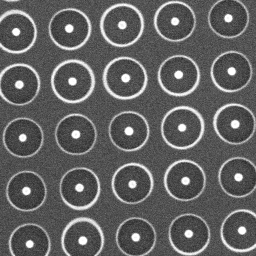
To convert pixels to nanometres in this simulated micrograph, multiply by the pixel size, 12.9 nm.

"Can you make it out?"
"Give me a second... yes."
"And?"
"an array of small figures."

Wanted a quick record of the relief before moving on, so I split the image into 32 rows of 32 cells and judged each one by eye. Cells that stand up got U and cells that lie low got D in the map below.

UUUUUUUUUUUUUUUUUUUUUDDUUUUDDDUU
UUUUUUUUDDUUUDDDDUUUDDDDUUDDDDDU
DDDDUUUDDDDUUDDDDDUUDDDDUUDDDDDU
DDDDUUDDDDDUUDDDDDUUDDDDUUUDDDDU
DDDDUUDDDDDUUDDDDUUUDDDUUUUUDUUU
DDDDUUUDDDUUUUDDUUUUUUUUUUUUUUUU
UUUUUUUUUUUUUUUUUUUUUUUUUUUUUUUU
UUUUUUUUUUUUUUUDDUUUUDDDUUUDDDDU
UDDDUUUDDDDUUDDDDDUUDDDDDUUDDDDU
DDDDDUUDDDDDUDDDDDUUDDDDDUUDDDDU
DDUDDUUDDDDDUDDDDDUUDDDDUUUDDDDU
DDDDDUUDDDDUUUDDDDUUUDDDUUUUUUUU
UDDDUUUUDDUUUUUUUUUUUUUUUUUUUUUU
UUUUUUUUUUUUUUUUUUUUUUDUUUUUDDDU
UUUUUUUUUDUUUUUDDUUUUDDDDUUDDDDD
UDDDUUUDDDDDUUDDDDUUDDDDDUUDDUDD
UDDDDUUDDDDDUUDDDDUUDDDDDUUDDDDD
UDDDDUUDDDDDUUDDDDUUUDDDDUUUDDDU
UDDDDUUUDDDUUUUDDUUUUUUUUUUUUUUU
UUDUUUUUUUUUUUUUUUUUUUUUUUUUUUUU
UUUUUUUUUUUUUUUUUUUUUUDDUUUUDDDU
UUUUUUUUUDDUUUUDDDUUUDDDDUUUDDDD
UDDDDUUUDDDDUUDDDDDUUDDDDDUUDDDD
UDDDDDUUDDDDUUDDDDDUUDDDDUUUDDDD
UDDDDDUUDDDDUUUDDDUUUUDDDUUUUDUU
UUDDDUUUUDDUUUUUUUUUUUUUUUUUUUUU
UUUUUUUUUUUUUUUUUUUUUUUUUUUUUDDU
UUUUUUUUUUDUUUUUDDUUUUDDDUUUDDDD
UUDDDUUUDDDDUUUDDDDUUDDDDDUUDDDD
UUDDDDUUDDDDDUUDDDDUUDDDDDUUDDDD
UDDDDDUUDDDDDUUDDDDUUUDDDDUUDDDD
UUDDDDUUDDDDUUUUDDUUUUUDDUUUUUUU